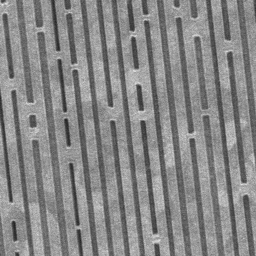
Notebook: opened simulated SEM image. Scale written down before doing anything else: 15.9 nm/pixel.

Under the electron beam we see parallel lines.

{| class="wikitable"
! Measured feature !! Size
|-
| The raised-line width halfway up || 154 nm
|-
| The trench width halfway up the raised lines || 98.9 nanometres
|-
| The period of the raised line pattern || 0.249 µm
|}